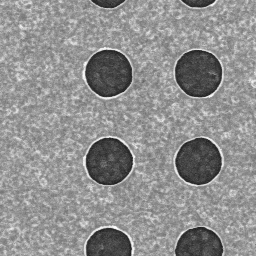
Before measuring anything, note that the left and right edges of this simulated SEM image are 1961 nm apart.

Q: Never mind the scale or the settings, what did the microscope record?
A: holes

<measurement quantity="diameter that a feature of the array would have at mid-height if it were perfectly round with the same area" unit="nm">368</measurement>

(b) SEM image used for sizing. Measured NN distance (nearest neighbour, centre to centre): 676 nm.